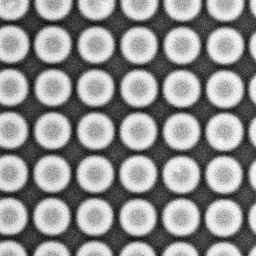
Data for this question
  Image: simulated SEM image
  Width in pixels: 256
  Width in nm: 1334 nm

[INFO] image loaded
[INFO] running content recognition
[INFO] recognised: an array of small figures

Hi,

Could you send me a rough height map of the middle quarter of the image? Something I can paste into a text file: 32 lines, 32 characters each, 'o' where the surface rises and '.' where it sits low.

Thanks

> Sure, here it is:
................................
................................
.....oooooo.....ooooo......ooooo
o...oooooooo...ooooooo....oooooo
oo..oooooooo...oooooooo..ooooooo
oo..oooooooo..ooooooooo..ooooooo
oo..oooooooo..ooooooooo..ooooooo
o...oooooooo..ooooooooo..ooooooo
o...ooooooo....oooooooo...oooooo
.....oooooo.....oooooo....oooooo
..................oo........ooo.
................................
.......oo........ooo............
.....oooooo.....oooooo.....ooooo
o...oooooooo...ooooooo....oooooo
o...oooooooo..ooooooooo..ooooooo
o...oooooooo..ooooooooo..ooooooo
o...oooooooo..ooooooooo..ooooooo
o...oooooooo..ooooooooo..ooooooo
o...oooooooo...ooooooo....oooooo
......oooo......ooooo......ooooo
................................
................................
......oooo.......ooo........ooo.
.....oooooo....ooooooo....oooooo
o...oooooooo...oooooooo..ooooooo
o...oooooooo..ooooooooo..ooooooo
o..ooooooooo..ooooooooo..ooooooo
o..ooooooooo..ooooooooo..ooooooo
o...oooooooo...oooooooo..ooooooo
....ooooooo....ooooooo....oooooo
......oooo.......oooo......ooooo